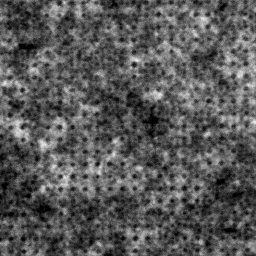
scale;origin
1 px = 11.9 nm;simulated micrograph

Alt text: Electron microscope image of a regular array of raised bodies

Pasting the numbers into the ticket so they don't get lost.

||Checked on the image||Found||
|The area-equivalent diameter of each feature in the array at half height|0.0698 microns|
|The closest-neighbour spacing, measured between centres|0.145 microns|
